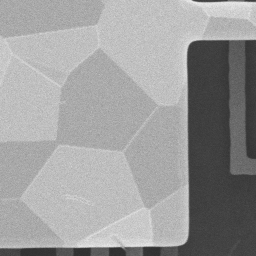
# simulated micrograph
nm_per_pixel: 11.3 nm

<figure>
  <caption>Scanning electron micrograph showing wiring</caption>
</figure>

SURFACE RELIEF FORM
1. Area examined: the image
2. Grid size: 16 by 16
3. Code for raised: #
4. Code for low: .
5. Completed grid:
################
################
#############...
############....
############....
############....
############....
############....
############....
############....
############....
############....
############....
############....
############....
##..............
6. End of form